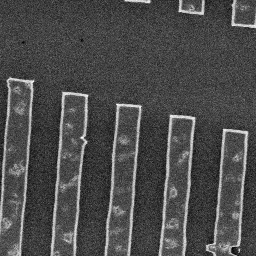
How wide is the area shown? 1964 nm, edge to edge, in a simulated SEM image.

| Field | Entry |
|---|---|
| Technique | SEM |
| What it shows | parallel lines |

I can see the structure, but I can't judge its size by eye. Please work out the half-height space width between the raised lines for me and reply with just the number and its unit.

0.237 um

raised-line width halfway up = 178 nanometers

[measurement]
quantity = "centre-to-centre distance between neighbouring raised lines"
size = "414 nm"